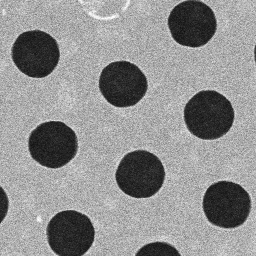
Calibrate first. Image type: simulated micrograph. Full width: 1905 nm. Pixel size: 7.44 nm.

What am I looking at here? holes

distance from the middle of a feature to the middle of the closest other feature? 679 nanometers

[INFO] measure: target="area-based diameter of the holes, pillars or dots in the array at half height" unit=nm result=356